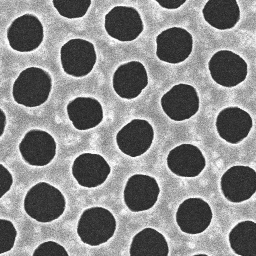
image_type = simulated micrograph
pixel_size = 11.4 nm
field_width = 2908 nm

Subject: a regular array of holes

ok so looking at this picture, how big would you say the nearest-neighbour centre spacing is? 627 nanometers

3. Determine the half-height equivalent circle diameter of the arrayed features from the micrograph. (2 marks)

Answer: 36.8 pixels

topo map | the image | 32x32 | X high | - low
XXXXXXX----XXXXXXXXX---XXX----XX
XXXXXXX----XXX---XXXXXXXX-----XX
XX---XXXXXXXX-----XXXXXXXX----XX
X----XXXXXXXX-----XXX--XXXX--XXX
X----XXXXXXXXX---XXX----XXXXXXXX
X----XXX---XXXXXXXXX----XXXXXXXX
XXXXXXXX----XXXXXXXX----XXX--XXX
XXXXXXXX----XXXXXXXX---XXX----XX
XXXX-XXX----XXX---XXXXXXXX-----X
XX----XXX-XXXX----XXXXXXXX-----X
XX----XXXXXXXX----XXXXXXXXX---XX
XX----XXXXXXXX----XXX----XXXXXXX
XX----XXX---XXXXXXXX-----XXXXXXX
XXXXXXXX-----XXXXXXX-----XXX--XX
-XXXXXXXX----XXXXXXXX---XXX----X
-XXXXXXXX---XXXX---XXXXXXXX-----
XXXX--XXXXXXXXX----XXXXXXXX----X
XXX----XXXXXXXX----XXXXXXXXX--XX
XX-----XXXXXXXX----XXX---XXXXXXX
XXX----XXX---XXX-XXXX----XXXXXXX
XXXX--XXX-----XXXXXXX-----XXXXXX
-XXXXXXXX-----XXXXXXXX---XXX----
--XXXXXXXX---XXX---XXXXXXXXX----
-XXX---XXXXXXXXX----XXXXXXXX----
XXX-----XXXXXXXX----XXXXXXXX---X
XXX-----XXXXXXXX---XXXX---XXXXXX
XXX-----XXX---XXXXXXXX----XXXXXX
-XXX---XXX----XXXXXXXX----XXXXXX
--XXXXXXXX----XXXX-XXXX---XXX---
--XXXXXXXX----XXX---XXXXXXXXX---
--XXX--XXXX--XXX-----XXXXXXXX---
-XXX----XXXXXXXX-----XXXXXXXX---